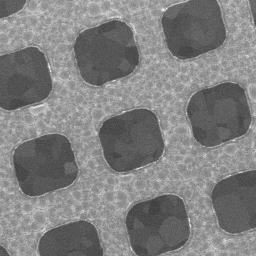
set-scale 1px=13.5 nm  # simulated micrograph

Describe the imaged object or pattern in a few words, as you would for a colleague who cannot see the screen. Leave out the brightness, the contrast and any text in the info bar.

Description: raised bodies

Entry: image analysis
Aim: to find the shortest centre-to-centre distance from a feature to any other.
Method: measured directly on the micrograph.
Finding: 90.7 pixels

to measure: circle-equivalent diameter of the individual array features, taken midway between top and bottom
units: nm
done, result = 872